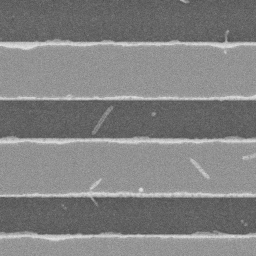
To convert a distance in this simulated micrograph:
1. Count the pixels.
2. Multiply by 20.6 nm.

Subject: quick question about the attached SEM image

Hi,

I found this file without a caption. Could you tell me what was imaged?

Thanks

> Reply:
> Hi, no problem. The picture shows lines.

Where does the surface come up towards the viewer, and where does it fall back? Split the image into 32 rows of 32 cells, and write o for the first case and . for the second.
................................
................................
................................
................................
................................
o...ooooooooooooooooooooooo.oooo
oooooooooooooooooooooooooooooooo
oooooooooooooooooooooooooooooooo
oooooooooooooooooooooooooooooooo
oooooooooooooooooooooooooooooooo
oooooooooooooooooooooooooooooooo
oooooooooooooooooooooooooooooooo
................................
................................
................................
................................
................................
..ooo....ooooo............oo....
oooooooooooooooooooooooooooooooo
oooooooooooooooooooooooooooooooo
oooooooooooooooooooooooooooooooo
oooooooooooooooooooooooooooooooo
oooooooooooooooooooooooooooooooo
oooooooooooooooooooooooooooooooo
................................
................................
................................
................................
................................
.oooo.......oo..ooo.........oo..
oooooooooooooooooooooooooooooooo
oooooooooooooooooooooooooooooooo